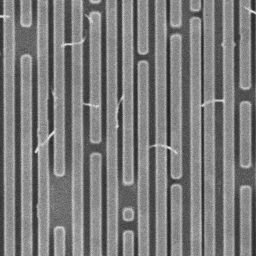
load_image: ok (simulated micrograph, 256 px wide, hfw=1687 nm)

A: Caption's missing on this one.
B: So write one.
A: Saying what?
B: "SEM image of parallel lines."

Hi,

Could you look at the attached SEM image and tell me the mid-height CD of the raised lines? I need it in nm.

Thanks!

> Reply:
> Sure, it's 72.5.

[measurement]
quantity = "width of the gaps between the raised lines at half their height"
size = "0.0395 um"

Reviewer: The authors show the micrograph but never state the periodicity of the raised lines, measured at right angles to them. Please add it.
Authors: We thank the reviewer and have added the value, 0.111 micrometres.